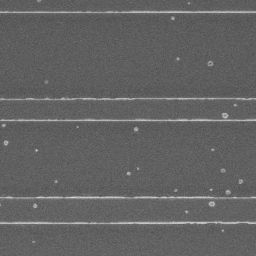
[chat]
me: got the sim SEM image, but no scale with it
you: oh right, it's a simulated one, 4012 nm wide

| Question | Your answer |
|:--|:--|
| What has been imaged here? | lines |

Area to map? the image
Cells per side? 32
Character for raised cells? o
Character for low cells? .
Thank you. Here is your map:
oooooooooooooooooooooooooooooooo
oooooooooooooooooooooooooooooooo
................................
................................
................................
................................
................................
................................
................................
................................
................................
................................
oooooooooooooooooooooooooooooooo
oooooooooooooooooooooooooooooooo
oooooooooooooooooooooooooooooooo
................................
................................
................................
................................
................................
................................
................................
................................
................................
................................
oooooooooooooooooooooooooooooooo
oooooooooooooooooooooooooooooooo
oooooooooooooooooooooooooooooooo
................................
................................
................................
................................